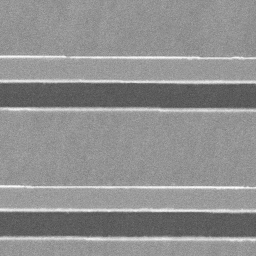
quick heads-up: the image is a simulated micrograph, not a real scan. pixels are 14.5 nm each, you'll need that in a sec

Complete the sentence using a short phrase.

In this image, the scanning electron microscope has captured lines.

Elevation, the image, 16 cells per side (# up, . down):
################
################
################
################
################
................
................
################
################
################
################
################
################
................
................
################